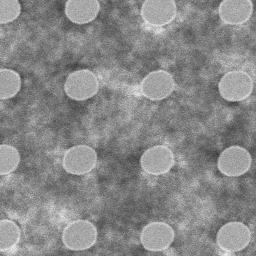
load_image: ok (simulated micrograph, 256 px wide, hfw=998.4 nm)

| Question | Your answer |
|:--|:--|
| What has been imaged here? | a regular array of raised bodies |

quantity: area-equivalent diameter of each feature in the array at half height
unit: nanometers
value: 123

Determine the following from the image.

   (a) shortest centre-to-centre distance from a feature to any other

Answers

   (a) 294 nm